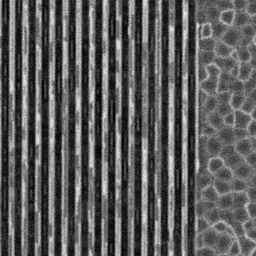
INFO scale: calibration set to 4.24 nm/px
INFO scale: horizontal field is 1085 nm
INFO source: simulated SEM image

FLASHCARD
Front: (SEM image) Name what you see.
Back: parallel lines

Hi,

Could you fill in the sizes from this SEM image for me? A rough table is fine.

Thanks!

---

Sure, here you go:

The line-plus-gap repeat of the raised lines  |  0.0565 µm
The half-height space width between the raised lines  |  32.8 nm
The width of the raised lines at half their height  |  0.0249 µm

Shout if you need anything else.